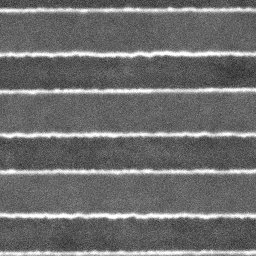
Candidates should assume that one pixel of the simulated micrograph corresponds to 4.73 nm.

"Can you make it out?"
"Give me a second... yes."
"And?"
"lines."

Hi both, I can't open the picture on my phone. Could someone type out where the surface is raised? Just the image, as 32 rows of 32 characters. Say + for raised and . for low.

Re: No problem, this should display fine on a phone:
................................
++++++++++++++++++++++++++++++++
++++++++++++++++++++++++++++++++
++++++++++++++++++++++++++++++++
++++++++++++++++++++++++++++++++
++++++++++++++++++++++++++++++++
++++++++++++++++++++++++++++++++
................................
................................
................................
................................
++++++++++++++++++++++++++++++++
++++++++++++++++++++++++++++++++
++++++++++++++++++++++++++++++++
++++++++++++++++++++++++++++++++
++++++++++++++++++++++++++++++++
++++++++++++++++++++++++++++++++
................................
................................
................................
................................
++++++++++++++++++++++++++++++++
++++++++++++++++++++++++++++++++
++++++++++++++++++++++++++++++++
++++++++++++++++++++++++++++++++
++++++++++++++++++++++++++++++++
++++++++++++++++++++++++++++++++
................................
................................
................................
................................
...............................+